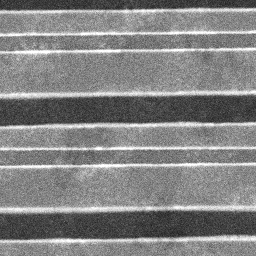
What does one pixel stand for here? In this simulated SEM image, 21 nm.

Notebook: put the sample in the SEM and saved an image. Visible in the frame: lines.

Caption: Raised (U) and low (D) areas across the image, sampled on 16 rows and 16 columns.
DDDDDDDDDDDDDDDD
UUUUUUUUUUUUUUUU
UUUUUUUUUUUUUUUU
UUUUUUUUUUUUUUUU
UUUUUUUUUUUUUUUU
UUUUUUUUUUUUUUUU
DDDDDDDDDDDDDDDD
DDDDDDDDDDDDDDDD
UUUUUUUUUUUUUUUU
UUUUUUUUUUUUUUUU
UUUUUUUUUUUUUUUU
UUUUUUUUUUUUUUUU
UUUUUUUUUUUUUUUU
DDDDDDDDDDDDDDDD
DDDDDDDDDDDDDDDD
UUUUUUUUUUUUUUUU